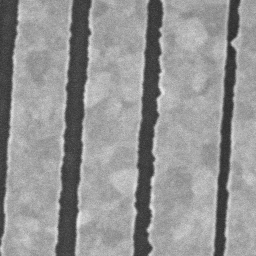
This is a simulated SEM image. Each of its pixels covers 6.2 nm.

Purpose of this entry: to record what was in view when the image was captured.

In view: one or a few lines or trenches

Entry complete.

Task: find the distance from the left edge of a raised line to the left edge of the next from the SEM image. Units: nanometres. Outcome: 469